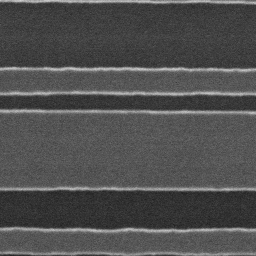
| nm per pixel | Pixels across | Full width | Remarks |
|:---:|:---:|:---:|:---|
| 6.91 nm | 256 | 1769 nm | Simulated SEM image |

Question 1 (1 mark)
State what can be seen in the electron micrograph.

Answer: lines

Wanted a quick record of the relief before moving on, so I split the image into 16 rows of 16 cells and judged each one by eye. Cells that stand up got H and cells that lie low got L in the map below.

LLLLLLLLLLLLLLLL
LLLLLLLLLLLLLLLL
LLLLLLLLLLLLLLLL
LLLLLLLLLLLLLLLL
HHHHHHHHHHHHHHHH
HHHHHHHHHHHHHHHH
HHHHHHHHHHHHHHHH
HHHHHHHHHHHHHHHH
HHHHHHHHHHHHHHHH
HHHHHHHHHHHHHHHH
HHHHHHHHHHHHHHHH
HHHHHHHHHHHHHHHH
LLLLLLLLLLLLLLLL
LLLLLLLLLLLLLLLL
HHHHHHHHHHHHHHHH
HHHHHHHHHHHHHHHH